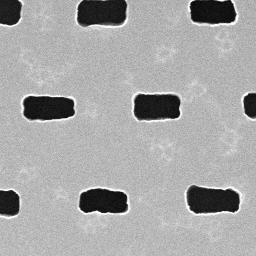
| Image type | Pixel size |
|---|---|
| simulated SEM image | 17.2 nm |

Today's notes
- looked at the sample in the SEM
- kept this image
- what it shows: holes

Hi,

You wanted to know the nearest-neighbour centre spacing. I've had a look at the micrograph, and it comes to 1860 nanometers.